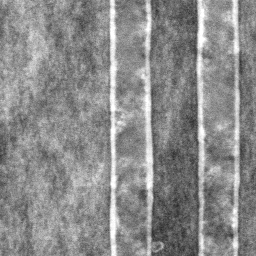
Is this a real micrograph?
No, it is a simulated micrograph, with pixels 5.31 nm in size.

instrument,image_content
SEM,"one or a few lines or trenches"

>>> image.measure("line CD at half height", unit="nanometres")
195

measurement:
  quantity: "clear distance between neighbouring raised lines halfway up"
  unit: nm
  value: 267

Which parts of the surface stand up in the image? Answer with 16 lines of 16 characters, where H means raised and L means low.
LLLLLLLHHLLLHHHL
LLLLLLLHHLLLHHHL
LLLLLLLHHLLLHHHL
LLLLLLLHHLLLHHHL
LLLLLLLHHLLLHHHL
LLLLLLLHHLLLHHHL
LLLLLLLHHLLLHHHL
LLLLLLLHHLLLLHHL
LLLLLLLHHLLLLHHL
LLLLLLLHHLLLLHHL
LLLLLLLHHLLLLHHL
LLLLLLLHHLLLLHHL
LLLLLLLHHLLLLHHL
LLLLLLLHHLLLLHHL
LLLLLLLHHLLLHHHL
LLLLLLLHHLLLLHHL